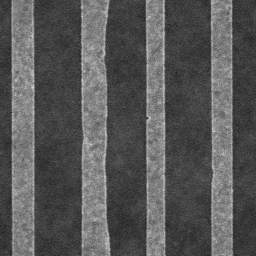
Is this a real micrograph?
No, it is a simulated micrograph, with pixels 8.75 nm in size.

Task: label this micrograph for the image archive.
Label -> one or a few lines or trenches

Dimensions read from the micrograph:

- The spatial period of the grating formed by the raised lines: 66.3 pixels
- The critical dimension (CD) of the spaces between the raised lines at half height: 0.419 µm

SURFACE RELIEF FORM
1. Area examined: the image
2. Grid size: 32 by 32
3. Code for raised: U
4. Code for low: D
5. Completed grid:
DDUUDDDDDDUUUDDDDDUUDDDDDDDUUDDD
DDUUDDDDDDUUUDDDDDUUDDDDDDDUUDDD
DDUUDDDDDDUUUDDDDDUUDDDDDDUUUDDD
DDUUDDDDDDUUUDDDDDUUDDDDDDUUUDDD
DDUUDDDDDDUUUDDDDDUUDDDDDDDUUDDD
DDDUDDDDDDUUUDDDDDUUDDDDDDDUUDDD
DDUUDDDDDDUUUDDDDDUUDDDDDDDUUDDD
DDUUDDDDDDUUUDDDDDUUDDDDDDDUUDDD
DDUUDDDDDDUUUDDDDDUUDDDDDDDUUDDD
DDUUDDDDDDUUUDDDDDUUDDDDDDDUUDDD
DDUUDDDDDDUUUDDDDDUUDDDDDDDUUDDD
DDUUDDDDDDUUUDDDDDUUDDDDDDDUUDDD
DDUUDDDDDDUUUDDDDDUUDDDDDDDUUDDD
DDUUDDDDDDUUUDDDDDUUDDDDDDDUUDDD
DDUUDDDDDDUUUDDDDDUUDDDDDDDUUDDD
DDUUDDDDDDUUUDDDDDUUUDDDDDDUUDDD
DDUUDDDDDDUUUDDDDDUUDDDDDDDUUDDD
DDUUDDDDDDUUUDDDDDUUDDDDDDDUUDDD
DDUUDDDDDDUUUDDDDDUUDDDDDDDUUDDD
DDUUDDDDDDUUUDDDDDUUDDDDDDDUUDDD
DDUUDDDDDDUUUDDDDDUUDDDDDDDUUDDD
DDUUDDDDDDUUUDDDDDUUDDDDDDDUUDDD
DDUUDDDDDDUUUDDDDDUUDDDDDDDUUDDD
DDUUDDDDDDUUUDDDDDUUDDDDDDDUUDDD
DDUUDDDDDDUUUDDDDDUUDDDDDDDUUDDD
DDUUDDDDDDUUUDDDDDUUDDDDDDDUUDDD
DDUUDDDDDDUUUDDDDDUUDDDDDDDUUDDD
DDUUDDDDDDUUUDDDDDUUDDDDDDDUUDDD
DDUUDDDDDDUUUDDDDDUUDDDDDDDUUDDD
DDUUDDDDDDUUUUDDDDUUDDDDDDDUUDDD
DDUUDDDDDDUUUUDDDDUUUDDDDDDUUDDD
DDUUDDDDDDUUUUDDDDUUUDDDDDDUUDDD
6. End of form